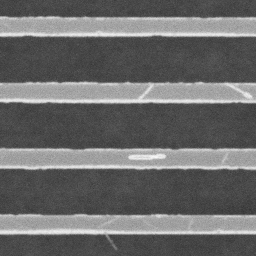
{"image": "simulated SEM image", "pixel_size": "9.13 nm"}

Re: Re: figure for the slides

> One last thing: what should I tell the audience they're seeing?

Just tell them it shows lines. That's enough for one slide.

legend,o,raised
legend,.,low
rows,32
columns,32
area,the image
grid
................................
................................
oooooooooooooooooooooooooooooooo
oooooooooooooooooooooooooooooooo
................................
................................
................................
................................
................................
................................
oooooooooooooooooooooooooooooooo
oooooooooooooooooooooooooooooooo
oooooooooooooooooooooooooooooooo
................................
................................
................................
................................
................................
................................
oooooooooooooooooooooooooooooooo
oooooooooooooooooooooooooooooooo
................................
................................
................................
................................
................................
................................
oooooooooooooooooooooooooooooooo
oooooooooooooooooooooooooooooooo
................................
................................
................................